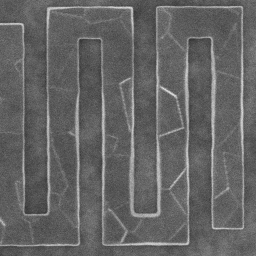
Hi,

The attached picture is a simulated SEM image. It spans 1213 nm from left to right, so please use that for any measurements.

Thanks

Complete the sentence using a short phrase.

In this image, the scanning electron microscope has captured groups of lines, slits or small figures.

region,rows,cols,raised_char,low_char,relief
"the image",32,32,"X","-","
--------------------------------
------XXXXXXXXXX----XXXXXXXXXX--
------XXXXXXXXXXX---XXXXXXXXXX--
XXX---XXXXXXXXXXX---XXXXXXXXXX--
XXX---XXXXXXXXXXX---XXXXXXXXXX--
XXX---XXXX---XXXX---XXX----XXX--
XXX---XXXX---XXXX---XXX----XXX--
XXX---XXXX---XXXX---XXX----XXX--
XXX---XXXX---XXXX---XXX----XXX--
XXX---XXXX---XXXX---XXX----XXX--
XXX---XXXX---XXXX---XXX----XXX--
XXX---XXXX---XXXX---XXX----XXX--
XXX---XXXX---XXXX---XXX----XXX--
XXX---XXXX---XXXX---XXX----XXX--
XXX---XXXX---XXXX---XXX----XXX--
XXX---XXXX---XXXX---XXX----XXX--
XXX---XXXX---XXXX---XXX----XXX--
XXX---XXXX---XXX----XXX----XXX--
XXX---XXXX---XXXX---XXX----XXX--
XXX---XXXX---XXXX---XXX----XXX--
XXX---XXXX---XXX----XXX----XXX--
XXX---XXXX---XXX----XXX----XXX--
XXX---XXXX---XXX----XXX----XXX--
XXX---XXXX---XXX----XXXX---XXX--
XXX---XXXX---XXX----XXX----XXX--
XXX---XXXX---XXX----XXX----XXX--
XXX---XXXX---XXXX---XXXX---XXX--
XXXXXXXXXX---XXXXXXXXXX----XXX--
XXXXXXXXXX---XXXXXXXXXXX---XXX--
XXXXXXXXXX---XXXXXXXXXXX--------
XXXXXXXXXX---XXXXX--------------
--------------------------------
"